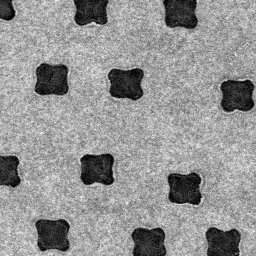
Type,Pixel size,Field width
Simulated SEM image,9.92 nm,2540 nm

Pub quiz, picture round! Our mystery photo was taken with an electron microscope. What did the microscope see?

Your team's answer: holes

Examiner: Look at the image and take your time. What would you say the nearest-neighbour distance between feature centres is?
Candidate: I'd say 79.5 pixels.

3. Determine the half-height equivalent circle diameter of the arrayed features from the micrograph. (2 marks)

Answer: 347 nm